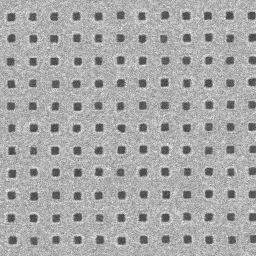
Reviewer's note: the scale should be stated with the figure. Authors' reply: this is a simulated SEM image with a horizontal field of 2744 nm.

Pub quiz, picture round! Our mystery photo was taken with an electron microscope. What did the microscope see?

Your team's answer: a regular array of holes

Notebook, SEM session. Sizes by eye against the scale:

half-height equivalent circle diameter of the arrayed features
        105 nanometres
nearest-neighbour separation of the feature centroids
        0.231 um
